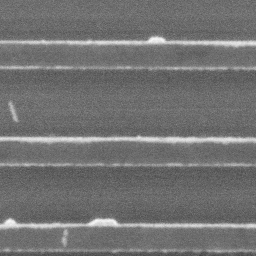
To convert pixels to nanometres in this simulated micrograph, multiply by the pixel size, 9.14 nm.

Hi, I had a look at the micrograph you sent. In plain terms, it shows lines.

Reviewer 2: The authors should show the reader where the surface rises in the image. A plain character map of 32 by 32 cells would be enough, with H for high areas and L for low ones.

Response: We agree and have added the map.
LLLLLLLLLLLLLLLLLLLLLLLLLLLLLLLL
LLLLLLLLLLLLLLLLLLLLLLLLLLLLLLLL
LLLLLLLLLLLLLLLLLLLLLLLLLLLLLLLL
LLLLLLLLLLLLLLLLLLLLLLLLLLLLLLLL
LLLLLLLLLLLLLLLLLLLLLLLLLLLLLLLL
HHHHHHHHHHHHHHHHHHHHHHHHHHHHHHHH
HHHHHHHHHHHHHHHHHHHHHHHHHHHHHHHH
HHHHHHHHHHHHHHHHHHHHHHHHHHHHHHHH
LLLLLLLLLLHLLLLLLLHLHHHHHHHHHHHH
LLLLLLLLLLLLLLLLLLLLLLLLLLLLLLLL
LLLLLLLLLLLLLLLLLLLLLLLLLLLLLLLL
LLLLLLLLLLLLLLLLLLLLLLLLLLLLLLLL
LLLLLLLLLLLLLLLLLLLLLLLLLLLLLLLL
LLLLLLLLLLLLLLLLLLLLLLLLLLLLLLLL
LLLLLLLLLLLLLLLLLLLLLLLLLLLLLLLL
LLLLLLLLLLLLLLLLLLLLLLLLLLLLLLLL
LLLLLLLLLLLLLLLLLLLLLLLLLLLLLLLL
HHHHHHHHHHHHHHHHHHHHHHHHHHHHHHHH
HHHHHHHHHHHHHHHHHHHHHHHHHHHHHHHH
HHHHHHHHHHHHHHHHHHHHHHHHHHHHHHHH
HHHHHHHHHHHHHHHHHHHHHHHHHHHHHHHH
LLLLLLLLLLLLLLLLLLLLLLLLLLLLLLLL
LLLLLLLLLLLLLLLLLLLLLLLLLLLLLLLL
LLLLLLLLLLLLLLLLLLLLLLLLLLLLLLLL
LLLLLLLLLLLLLLLLLLLLLLLLLLLLLLLL
LLLLLLLLLLLLLLLLLLLLLLLLLLLLLLLL
LLLLLLLLLLLLLLLLLLLLLLLLLLLLLLLL
LLLLLLLLLLLLLLLLLLLLLLLLLLLLLLLL
HHHHHHHHHHHHHHHHHHHHHHHHHHHHHHHH
HHHHHHHHHHHHHHHHHHHHHHHHHHHHHHHH
HHHHHHHHHHHHHHHHHHHHHHHHHHHHHHHH
LLLLLLLLLLLLLLLLLLLLLLLLLLLLLLLL